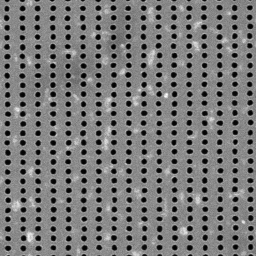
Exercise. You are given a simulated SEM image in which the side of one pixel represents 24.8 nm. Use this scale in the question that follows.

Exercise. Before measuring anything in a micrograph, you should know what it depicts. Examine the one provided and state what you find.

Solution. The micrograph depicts a regular array of holes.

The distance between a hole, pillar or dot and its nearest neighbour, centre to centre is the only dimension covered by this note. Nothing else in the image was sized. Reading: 233 nm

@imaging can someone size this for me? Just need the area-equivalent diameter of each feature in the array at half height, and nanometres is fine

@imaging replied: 151